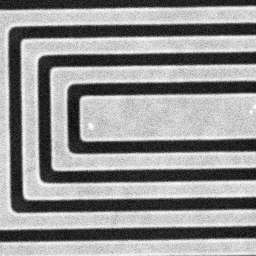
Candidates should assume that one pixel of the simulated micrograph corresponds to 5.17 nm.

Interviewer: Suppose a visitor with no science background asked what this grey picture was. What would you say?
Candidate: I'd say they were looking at groups of lines, slits or small figures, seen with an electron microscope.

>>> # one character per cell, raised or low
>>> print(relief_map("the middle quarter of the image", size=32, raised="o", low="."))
.....................ooooooooooo
oooooooooooooooooooooooooooooooo
oooooooooooooooooooooooooooooooo
oooooooooooooooooooooooooooooooo
ooooooooooooooooooooo...........
o...............................
o...............................
o...............................
o...oooooooooooooooooooooooooooo
o...oooooooooooooooooooooooooooo
o...oooooooooooooooooooooooooooo
o...oooooooooooooooooooooooooooo
o...oooooooooooooooooooooooooooo
o...oooooooooooooooooooooooooooo
o...oooooooooooooooooooooooooooo
o...oooooooooooooooooooooooooooo
o...oooooooooooooooooooooooooooo
o...oooooooooooooooooooooooooooo
o...oooooooooooooooooooooooooooo
o...............................
o...............................
o...............................
oo..............oooooooooooooooo
oooooooooooooooooooooooooooooooo
oooooooooooooooooooooooooooooooo
oooooooooooooooooooooooooooooooo
oo..............................
................................
................................
................................
oooooooooooooooooooooooooooooooo
oooooooooooooooooooooooooooooooo